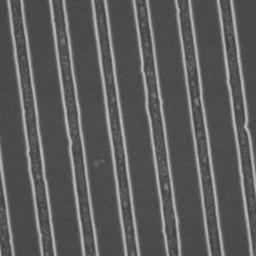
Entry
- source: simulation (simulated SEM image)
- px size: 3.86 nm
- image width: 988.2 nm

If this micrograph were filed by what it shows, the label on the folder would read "parallel lines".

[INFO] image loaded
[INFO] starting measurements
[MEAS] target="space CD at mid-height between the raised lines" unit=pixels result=11.5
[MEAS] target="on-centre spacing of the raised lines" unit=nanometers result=160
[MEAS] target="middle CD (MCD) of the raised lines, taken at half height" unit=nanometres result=114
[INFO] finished